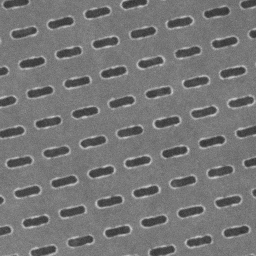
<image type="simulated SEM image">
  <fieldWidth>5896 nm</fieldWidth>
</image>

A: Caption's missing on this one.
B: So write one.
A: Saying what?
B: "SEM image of a regular array of holes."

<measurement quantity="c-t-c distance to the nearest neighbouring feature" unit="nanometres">709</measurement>